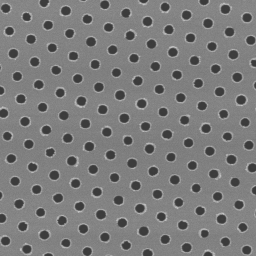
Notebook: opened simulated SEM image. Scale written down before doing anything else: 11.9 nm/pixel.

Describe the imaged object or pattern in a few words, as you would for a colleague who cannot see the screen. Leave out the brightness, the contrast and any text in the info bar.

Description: a regular array of holes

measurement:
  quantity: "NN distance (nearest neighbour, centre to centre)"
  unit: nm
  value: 269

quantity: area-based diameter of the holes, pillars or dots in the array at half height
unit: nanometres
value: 102